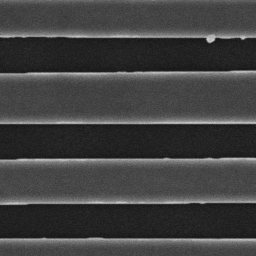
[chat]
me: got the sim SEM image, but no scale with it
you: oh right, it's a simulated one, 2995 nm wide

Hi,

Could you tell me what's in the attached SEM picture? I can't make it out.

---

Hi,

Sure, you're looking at lines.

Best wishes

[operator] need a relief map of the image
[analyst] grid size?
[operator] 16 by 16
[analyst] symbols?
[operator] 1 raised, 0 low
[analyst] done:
1111111111111111
1111111111111111
0000000000000000
0000000000000000
0000000000000011
1111111111111111
1111111111111111
1111111111111111
0000000000000000
0000000000000000
1111111111111111
1111111111111111
1111111111111111
0000000000000000
0000000000000000
1111111111111111